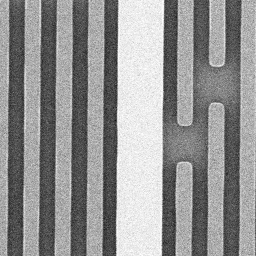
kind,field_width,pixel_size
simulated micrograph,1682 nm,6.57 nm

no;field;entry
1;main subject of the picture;groups of lines, slits or small figures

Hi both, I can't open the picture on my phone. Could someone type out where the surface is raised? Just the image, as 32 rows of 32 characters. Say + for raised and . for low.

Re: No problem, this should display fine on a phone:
+..++..++..++..+++++..++..++..++
+..++..++..++..+++++..++..++..++
+..++..++..++..+++++..++..++..++
+..++..++..++..+++++..++..++..++
+..++..++..++..+++++..++..++..++
+..++..++..++..+++++..++..++..++
+..++..++..++..+++++..++..++..++
+..++..++..++..+++++..++..++..++
+..++..++..++..+++++..++......++
+..++..++..++..+++++..++......++
+..++..++..++..+++++..++......++
+..++..++..++..+++++..++......++
+..++..++..++..+++++..++......++
+..++..++..++..+++++..++..++..++
+..++..++..++..+++++..++..++..++
+..++..++..++..+++++...+..++..++
+..++..++..++..+++++......++..++
+..++..++..++..+++++......++..++
+..++..++..++..+++++......++..++
+..++..++..++..+++++......++..++
+..++..++..++..+++++..++..++..++
+..++..++..++..+++++..++..++..++
+..++..++..++..+++++..++..++..++
+..++..++..++..+++++..++..++..++
+..++..++..++..+++++..++..++..++
+..++..++..++..+++++..++..++..++
+..++..++..++..+++++..++..++..++
+..++..++..++..+++++..++..++..++
+..++..++..++..+++++..++..++..++
+..++..++..++..+++++..++..++..++
+..++..++..++..+++++..++..++..++
+..++..++..++..+++++..++..++..++